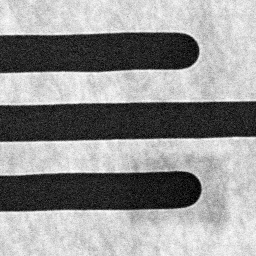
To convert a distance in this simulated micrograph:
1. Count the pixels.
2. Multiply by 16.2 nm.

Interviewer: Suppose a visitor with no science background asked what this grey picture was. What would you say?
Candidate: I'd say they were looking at groups of lines, slits or small figures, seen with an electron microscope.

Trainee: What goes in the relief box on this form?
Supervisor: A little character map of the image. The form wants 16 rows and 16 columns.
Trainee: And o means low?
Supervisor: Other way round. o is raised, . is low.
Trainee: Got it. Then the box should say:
oooooooooooooooo
oooooooooooooooo
............oooo
............oooo
.......ooooooooo
oooooooooooooooo
ooo.............
................
................
oooooooooooooooo
oooooooooooooooo
.............ooo
............oooo
oooooooooooooooo
oooooooooooooooo
oooooooooooooooo